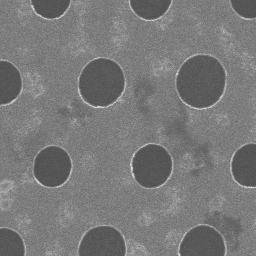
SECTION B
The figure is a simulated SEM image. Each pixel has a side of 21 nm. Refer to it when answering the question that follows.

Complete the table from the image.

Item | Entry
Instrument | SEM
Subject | holes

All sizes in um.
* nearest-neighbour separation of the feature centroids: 2.04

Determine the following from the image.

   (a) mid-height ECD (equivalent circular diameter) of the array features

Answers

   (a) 0.921 µm